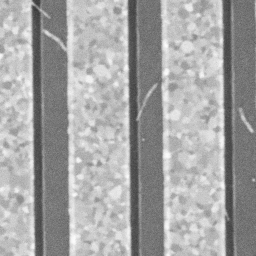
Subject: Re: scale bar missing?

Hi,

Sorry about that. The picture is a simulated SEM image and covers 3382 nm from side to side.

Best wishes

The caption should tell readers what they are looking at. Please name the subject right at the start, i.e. lines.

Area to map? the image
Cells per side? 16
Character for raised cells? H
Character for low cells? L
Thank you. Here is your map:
HHLLHHHHLLHHHHLL
HHLLHHHHLLHHHHLL
HHLLHHHHLLHHHHLL
HHLLHHHHLLHHHHLL
HHLLHHHHLLHHHHLL
HHLLHHHHLLHHHHLL
HHLLHHHHLLHHHHLL
HHLLHHHHLLHHHHLL
HHLLHHHHLLHHHHLL
HHLLHHHHLLHHHHLL
HHLLHHHHLLHHHHLL
HHLLHHHHLLHHHHLL
HHLLHHHHLLHHHHLL
HHLLHHHHLLHHHHLL
HHLLHHHHLLHHHHLL
HHLLHHHHLLHHHHLL